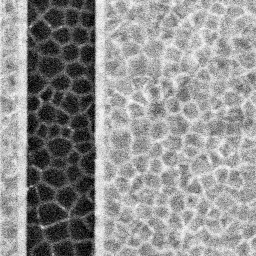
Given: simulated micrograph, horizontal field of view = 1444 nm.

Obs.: one or a few lines or trenches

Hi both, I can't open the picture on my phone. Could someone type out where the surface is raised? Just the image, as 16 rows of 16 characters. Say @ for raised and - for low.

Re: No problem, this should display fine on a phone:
@-----@@@@@@@@@@
@-----@@@@@@@@@@
@-----@@@@@@@@@@
@-----@@@@@@@@@@
@-----@@@@@@@@@@
@-----@@@@@@@@@@
@-----@@@@@@@@@@
@-----@@@@@@@@@@
@-----@@@@@@@@@@
@-----@@@@@@@@@@
@-----@@@@@@@@@@
@-----@@@@@@@@@@
@-----@@@@@@@@@@
@-----@@@@@@@@@@
@-----@@@@@@@@@@
@-----@@@@@@@@@@